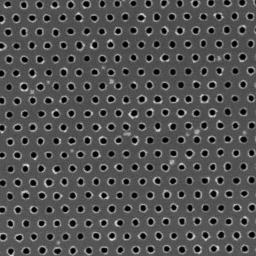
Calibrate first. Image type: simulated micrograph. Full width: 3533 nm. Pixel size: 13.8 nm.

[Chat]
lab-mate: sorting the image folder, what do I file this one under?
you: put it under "a regular array of holes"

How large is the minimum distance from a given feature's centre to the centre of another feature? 0.209 µm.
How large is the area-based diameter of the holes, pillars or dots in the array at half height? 86.7 nm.